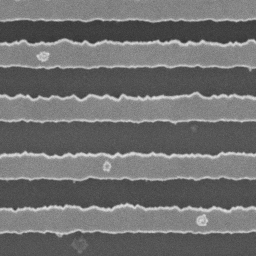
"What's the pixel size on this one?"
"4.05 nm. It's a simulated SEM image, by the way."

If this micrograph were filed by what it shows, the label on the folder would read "lines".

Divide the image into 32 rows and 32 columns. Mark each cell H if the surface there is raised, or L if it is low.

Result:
HHHHHHHHHHHHHHHHHHHHHHHHHHHHHHHH
HHHHHHHHHHHHHHHHHHHHHHHHHHHHHHHH
HHLLHHHHHHHHHHHHLHHHHHHHHLHHHHHL
LLLLLLLLLLLLLLLLLLLLLLLLLLLLLLLL
LLLLLLLLLLLLLLLLLLLLLLLLLLLLLLLL
HHHHHHHHHHHHHHHHHHHHHHHHHHHHHHHH
HHHHHHHHHHHHHHHHHHHHHHHHHHHHHHHH
HHHHHHHHHHHHHHHHHHHHHHHHHHHHHHHH
LLLLLLLLLLLHLLLLLLLLLLLLLLLLLLLL
LLLLLLLLLLLLLLLLLLLLLLLLLLLLLLLL
LLLLLLLLLLLLLLLLLLLLLLLLLLLLLLLL
LLLLLLLLLLLLLLLLLLLLLLLLLLLLLLLL
HHHHHHHHHHHHHHHHHHHHHHHHHHHHHHHH
HHHHHHHHHHHHHHHHHHHHHHHHHHHHHHHH
HHHHHHHHHHHHHHHHHHHHHHHHHHHHHHHH
LLLLLLLLLLLLLLLLLLLLLLLLLLLLLLLL
LLLLLLLLLLLLLLLLLLLLLLLLLLLLLLLL
LLLLLLLLLLLLLLLLLLLLLLLLLLLLLLLL
LLLLLLLLLLLLLLLLLLLLLLLLLLLLLLLL
HHHHHHHHHHHHHHHHHHHHHHHHHHHHHHHH
HHHHHHHHHHHHHHHHHHHHHHHHHHHHHHHH
HHHHHHHHHHHHHHHHHHHHHHHHHHHHHHHH
LLLLLLLLLHHLLLLLHLLHHLLLHLLLLLLL
LLLLLLLLLLLLLLLLLLLLLLLLLLLLLLLL
LLLLLLLLLLLLLLLLLLLLLLLLLLLLLLLL
LLLLLLLLLLLLLLLHLLLLLLLLLLLLLLLL
HHHHHHHHHHHHHHHHHHHHHHHHHHHHHHHH
HHHHHHHHHHHHHHHHHHHHHHHHHHHHHHHH
HHHHHHHHHHHHHHHHHHHHHHHHHHHHHHHH
LLLLLLLLLLLLLLLLLLLLLLLLLLLLLLLL
LLLLLLLLLLLLLLLLLLLLLLLLLLLLLLLL
LLLLLLLLLLLLLLLLLLLLLLLLLLLLLLLL